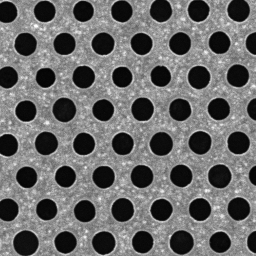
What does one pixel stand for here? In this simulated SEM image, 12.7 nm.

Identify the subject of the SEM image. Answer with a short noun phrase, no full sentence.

a regular array of holes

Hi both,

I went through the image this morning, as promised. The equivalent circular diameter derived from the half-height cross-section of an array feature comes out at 287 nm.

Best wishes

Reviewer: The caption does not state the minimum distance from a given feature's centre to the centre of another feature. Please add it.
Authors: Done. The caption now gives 480 nm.